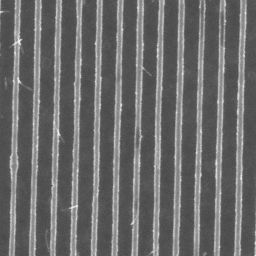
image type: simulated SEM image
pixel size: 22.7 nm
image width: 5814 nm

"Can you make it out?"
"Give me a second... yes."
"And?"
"parallel lines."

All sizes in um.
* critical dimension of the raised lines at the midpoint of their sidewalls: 0.116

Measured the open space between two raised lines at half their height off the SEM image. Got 346 nanometers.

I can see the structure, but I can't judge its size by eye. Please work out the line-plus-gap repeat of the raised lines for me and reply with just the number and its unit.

20.5 px